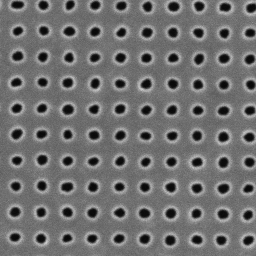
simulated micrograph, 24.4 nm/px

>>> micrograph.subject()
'a regular array of holes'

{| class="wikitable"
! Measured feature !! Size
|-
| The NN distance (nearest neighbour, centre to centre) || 618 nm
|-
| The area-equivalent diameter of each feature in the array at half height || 0.257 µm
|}